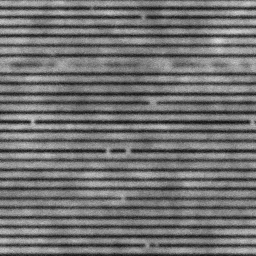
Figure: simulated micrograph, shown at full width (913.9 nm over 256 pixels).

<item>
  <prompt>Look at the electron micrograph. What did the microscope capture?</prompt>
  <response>parallel lines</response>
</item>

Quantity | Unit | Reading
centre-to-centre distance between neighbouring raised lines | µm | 0.0338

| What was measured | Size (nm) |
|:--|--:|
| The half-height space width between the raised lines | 9.8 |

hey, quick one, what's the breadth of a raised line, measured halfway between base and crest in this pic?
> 23.2 nanometers